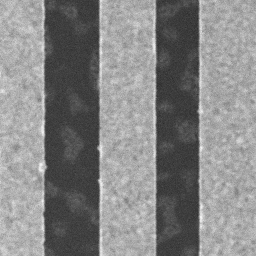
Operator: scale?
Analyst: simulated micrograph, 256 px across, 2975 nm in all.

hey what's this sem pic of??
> one or a few lines or trenches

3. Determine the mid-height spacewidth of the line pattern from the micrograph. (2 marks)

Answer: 0.527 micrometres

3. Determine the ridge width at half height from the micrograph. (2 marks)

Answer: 0.638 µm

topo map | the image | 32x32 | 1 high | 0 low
11111000000001111110000001111111
11111000000001111110000001111111
11111000000001111110000001111111
11111000000001111110000001111111
11111000000001111110000001111111
11111100000001111110000001111111
11111000000001111110000001111111
11111000000001111110000001111111
11111000000001111110000001111111
11111000000001111110000001111111
11111000000001111110000001111111
11111000000001111110000001111111
11111000010001111110000001111111
11111000000001111110000001111111
11111000000001111110000001111111
11111000000001111110000001111111
11111000000001111110000001111111
11111000000001111110000001111111
11111000000011111110000001111111
11111000000001111110000001111111
11111100000001111110000001111111
11111100000001111110000001111111
11111000000011111110000001111111
11111100000001111110000001111111
11111000000001111110000001111111
11111000010001111110000001111111
11111000000001111110000001111111
11111000000001111110000001111111
11111000000001111110000001111111
11111000000001111110000001111111
11111000000001111110000001111111
11111000000001111110000001111111